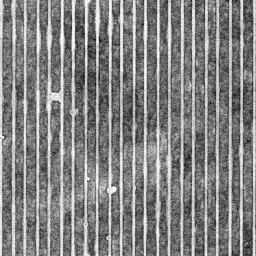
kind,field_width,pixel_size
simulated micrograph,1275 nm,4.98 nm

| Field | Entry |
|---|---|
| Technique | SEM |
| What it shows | parallel lines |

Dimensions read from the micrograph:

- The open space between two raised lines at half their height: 48.6 nm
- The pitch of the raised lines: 59.9 nanometers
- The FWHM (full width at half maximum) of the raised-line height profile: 0.0081 um